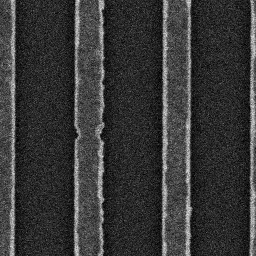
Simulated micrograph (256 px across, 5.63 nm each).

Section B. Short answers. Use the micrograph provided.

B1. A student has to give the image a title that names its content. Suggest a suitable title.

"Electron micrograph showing one or a few lines or trenches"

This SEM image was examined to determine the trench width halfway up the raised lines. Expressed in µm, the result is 0.351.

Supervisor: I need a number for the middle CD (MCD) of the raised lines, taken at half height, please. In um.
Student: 0.148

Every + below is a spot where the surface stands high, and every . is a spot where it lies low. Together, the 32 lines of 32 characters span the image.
++........+++........+++........
++........+++........+++........
++.......++++........+++........
++.......++++........+++........
++.......++++........+++.......+
++.......++++........+++.......+
++........+++........+++........
++........+++........+++........
++........+++........+++........
++........+++........+++.......+
++........+++........+++.......+
++........+++........+++.......+
++........+++........+++.......+
++........+++.......++++.......+
++........+++.......++++........
++........+++.......++++........
++........+++........+++.......+
++........+++.......++++........
++........+++.......++++.......+
++........+++.......++++........
++........+++.......++++........
++........+++........+++.......+
++........+++.......++++.......+
++........+++.......++++........
++........+++.......++++........
++.......++++........+++........
++.......++++.......++++........
++.......++++.......++++........
++.......++++.......++++........
++.......++++.......++++........
++.......++++.......++++........
++.......++++.......++++.......+